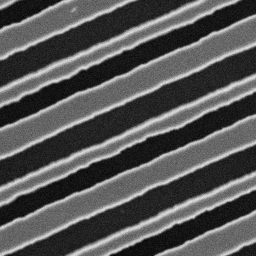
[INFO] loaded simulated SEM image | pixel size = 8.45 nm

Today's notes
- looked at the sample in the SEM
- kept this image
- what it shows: lines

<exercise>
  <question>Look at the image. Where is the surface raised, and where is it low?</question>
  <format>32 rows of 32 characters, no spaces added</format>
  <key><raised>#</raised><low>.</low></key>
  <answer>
#......########.........#####...
.....########.........#####.....
...########.........#####.....##
#########........#####......####
######.........#####......######
####.........####.......########
##.........####.......########..
........#####......########.....
......#####......########.......
....#####......########.........
..####.......#######.........###
####......#########........#####
##......########.........#####..
......########.........####.....
....########........#####......#
.########.........#####......###
#######.........#####......#####
#####.........####.......#######
###.........####.......########.
#........#####......########....
.......####.......########......
.....####.......########........
..#####......#########........##
#####......########.........####
##.......########........#####..
#.....#########........#####....
....########.........####.......
..########.........####......###
########.........####......#####
######........#####......#######
###.........#####......########.
#.........#####.....#########...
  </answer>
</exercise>